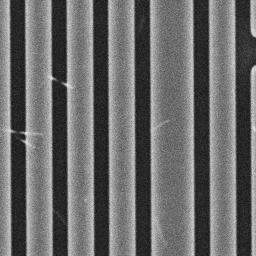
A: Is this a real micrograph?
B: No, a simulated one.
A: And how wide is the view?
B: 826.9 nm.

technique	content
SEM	groups of lines, slits or small figures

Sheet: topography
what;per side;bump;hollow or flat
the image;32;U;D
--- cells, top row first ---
UDDUUUDDUUUUDDUUUDDUUUUUDDUUUDDU
UDDUUUDDUUUUDDUUUDDUUUUUDDUUUDDU
UDDUUUDDUUUUDDUUUDDUUUUUDDUUUDDU
UDDUUUDDUUUUDDUUUDDUUUUUDDUUUDDU
UDDUUUDDUUUUDDUUUDDUUUUUDDUUUDDD
UDDUUUDDUUUUDDUUUDDUUUUUDDUUUDDD
UDDUUUDDUUUUDDUUUDDUUUUUDDUUUDDD
UDDUUUDDUUUUDDUUUDDUUUUUDDUUUDDD
UDDUUUDDUUUUDDUUUDDUUUUUDDUUUDDD
UDDUUUUDUUUUDDUUUDDUUUUUDDUUUDDU
UDDUUUDDUUUUDDUUUDDUUUUUDDUUUDDU
UDDUUUDDUUUUDDUUUDDUUUUUDDUUUDDU
UDDUUUDDUUUUDDUUUDDUUUUUDDUUUDDU
UDDUUUDDUUUUDDUUUDDUUUUUDDUUUDDD
UDDUUUDDUUUUDDUUUDDUUUUUDDUUUDDD
UDDUUUDDUUUUDDUUUDDUUUUUDDUUUDDD
UDDUUUDDUUUUDDUUUDDUUUUUDDUUUDDD
UDDUUUDDUUUUDDUUUDDUUUUUDDUUUDDD
UDDUUUDDDUUUDDUUUDDUUUUUDDUUUDDD
UDDUUUDDDUUUDDUUUDDUUUUUDDUUUDDD
UDDUUUDDDUUUDDUUUDDUUUUUDDUUUDDD
UDDUUUDDDUUUDDUUUDDUUUUUDDUUUDDD
UDDUUUDDDUUUDDUUUDDUUUUUDDUUUDDD
UDDUUUDDDUUUDDUUUDDUUUUUDDUUUDDD
UDDUUUDDDUUUDDUUUDDUUUUUDDUUUDDD
UDDUUUDDDUUUDDUUUDDUUUUUDDUUUDDD
UDDUUUDDDUUUDDUUUDDUUUUUDDUUUDDD
UDDUUUDDDUUUDDUUUDDUUUUUDDUUUDDD
UDDUUUDDDUUUDDUUUDDUUUUUDDUUUDDD
UDDUUUDDDUUUDDUUUDDUUUUUDDUUUDDD
UDDUUUDDDUUUDDUUUDDUUUUUDDUUUDDD
UDDUUUDDDUUUDDUUUDDUUUUUDDUUUDDD